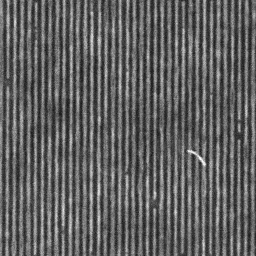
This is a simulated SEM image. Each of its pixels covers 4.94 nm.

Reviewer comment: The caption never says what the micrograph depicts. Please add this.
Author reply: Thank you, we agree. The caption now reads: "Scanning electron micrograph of parallel lines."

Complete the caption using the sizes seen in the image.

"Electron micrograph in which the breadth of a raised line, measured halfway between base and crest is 0.013 µm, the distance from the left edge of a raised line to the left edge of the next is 34.7 nm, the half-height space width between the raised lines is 0.0222 µm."